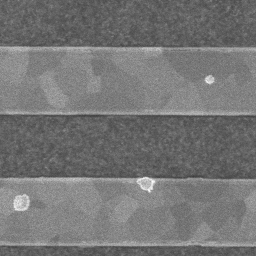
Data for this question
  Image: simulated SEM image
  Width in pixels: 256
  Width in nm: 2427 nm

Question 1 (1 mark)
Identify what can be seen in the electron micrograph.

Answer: one or a few lines or trenches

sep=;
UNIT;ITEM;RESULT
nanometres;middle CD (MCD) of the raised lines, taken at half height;619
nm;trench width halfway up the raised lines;619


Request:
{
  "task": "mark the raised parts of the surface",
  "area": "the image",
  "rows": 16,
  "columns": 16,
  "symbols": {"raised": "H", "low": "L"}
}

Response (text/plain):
LLLLLLLLLLLLLLLL
LLLLLLLLLLLLLLLL
LLLLLLLLLLLLLLLL
HHHHHHHHHHHHHHHH
HHHHHHHHHHHHHHHH
HHHHHHHHHHHHHHHH
HHHHHHHHHHHHHHHH
LLLLLLLLLLLLLLLL
LLLLLLLLLLLLLLLL
LLLLLLLLLLLLLLLL
LLLLLLLLLLLLLLLL
HHHHHHHHHHHHHHHH
HHHHHHHHHHHHHHHH
HHHHHHHHHHHHHHHH
HHHHHHHHHHHHHHHH
LLLLLLLLLLLLLLLL